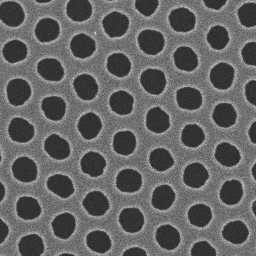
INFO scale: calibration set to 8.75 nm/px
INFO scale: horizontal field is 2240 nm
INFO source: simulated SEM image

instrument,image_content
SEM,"a regular array of holes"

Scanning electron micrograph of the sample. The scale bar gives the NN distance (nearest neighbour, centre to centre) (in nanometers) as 335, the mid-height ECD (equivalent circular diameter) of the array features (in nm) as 219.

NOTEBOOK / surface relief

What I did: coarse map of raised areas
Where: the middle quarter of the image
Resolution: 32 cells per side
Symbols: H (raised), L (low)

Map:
HHHHHHHHHHHLLLLLLHHHHHHHHHHHLLLL
HHHHHHHHHHHLLLLLLHHHLLLLHHHHHLLL
HHHHHLHHHHHHLLLLHHHLLLLLLHHHHHHH
HHHLLLLHHHHHHHHHHHHLLLLLLHHHHHHH
HHLLLLLLHHHHHHHHHHHLLLLLLLHHHHHH
HHLLLLLLLHHHHHHHHHHHLLLLLHHHHHHH
HHHLLLLLHHHHHHHHHHHHLLLLLHHHLLLL
HHHLLLLLHHHHLLLLHHHHHHLLHHHHLLLL
HHHHLLLLHHHLLLLLLHHHHHHHHHHHLLLL
HHHHHHHHHHHLLLLLLLHHHHHHHHHHLLLL
LHHHHHHHHHHHLLLLLHHHHHHHHHHHHLLL
HHHHHHHHHHHHLLLLLHHHHLLLLHHHHHHL
HHHHHLLLHHHHHLLLHHHHHLLLLLHHHHHH
HHHHLLLLLHHHHHHHHHHHHLLLLLHHHHHH
HHHLLLLLLHHHHHHHHHHHLLLLLLHHHHHH
HHHLLLLLLLHHHHHHHHHHHLLLLLHHHHLL
HHHHLLLLLHHHHHHHHHHHHLLLLLHHHHLL
HHHHLLLLLHHHHLLLLHHHHHHHHHHHHLLL
HHHHHLLLHHHHLLLLLLHHHHHHHHHHHLLL
LHHHHHHHHHHHLLLLLLHHHHHHHHHHHHLL
LHHHHHHHHHHHLLLLLLHHHHHHHHHHHHHL
LHHHHHHHHHHHLLLLLLHHHHLLLLHHHHHH
LLHHHLLLLHHHHHLLLHHHHHLLLLLHHHHH
LHHHLLLLLLHHHHHHHHHHHLLLLLLHHHHH
HHHHLLLLLLLHHHHHHHHHHLLLLLLHHHHH
HHHHLLLLLLLHHHHHHHHHHHLLLLLHHHHL
HHHHLLLLLLHHHHHLLLHHHHHLLLHHHHLL
HHHHHHLLLHHHHLLLLLLHHHHHHHHHHHLL
LHHHHHHHHHHHHLLLLLLLHHHHHHHHHHLL
LLHHHHHHHHHHHLLLLLLLHHHHHHHHHHLL
LLHHHHHHHHHHHLLLLLLHHHHHLLHHHHHL
LLLHHHHHHHHHHHLLLLLHHHHLLLLHHHHH